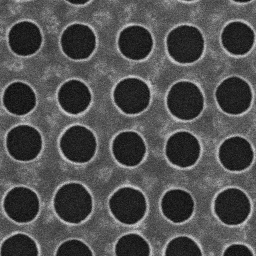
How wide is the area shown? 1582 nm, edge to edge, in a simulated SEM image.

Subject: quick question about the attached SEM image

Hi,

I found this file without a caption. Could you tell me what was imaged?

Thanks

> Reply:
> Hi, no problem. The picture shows a regular array of holes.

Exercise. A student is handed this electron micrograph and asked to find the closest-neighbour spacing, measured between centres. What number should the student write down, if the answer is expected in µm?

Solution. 0.308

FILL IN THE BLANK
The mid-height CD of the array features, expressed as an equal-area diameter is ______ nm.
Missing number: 227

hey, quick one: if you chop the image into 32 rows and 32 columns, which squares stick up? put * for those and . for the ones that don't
*********..*********************
********************************
********************************
*....***...*****..****...***...*
*....***....***....**....***....
*....***....***....**.....**....
**..****....***....**....***...*
*****************.****...*******
********************************
********************************
*..*****...****...****..***....*
*...***....***.....**....**.....
.....**....***.....**....**....*
*...****...****...***....***...*
**********************...*******
********************************
*....***...****..*****.*********
*....**.....**....***....***...*
*....**.....**....***....**.....
*....***....**....***....**.....
***************..****...****...*
********************************
********************************
**..***....****..************.**
*....**....***....**....***....*
.....**.....**....**....***....*
*....**....***....**....***....*
**..****...****...***..****....*
********************************
*...***********...**************
.....***...****....**....*******
.....**....***.....**....***....